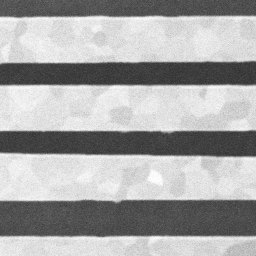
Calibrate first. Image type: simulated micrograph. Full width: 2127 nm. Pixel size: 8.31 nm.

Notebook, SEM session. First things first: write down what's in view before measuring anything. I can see lines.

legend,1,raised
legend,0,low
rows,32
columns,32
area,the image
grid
00000000000000000000000000000000
00000000000000000000000000000000
11111111111111111111111111111111
11111111111111111111111111111111
11111111111111111111111111111111
11111111111111111111111111111111
11111111111111111111111111111111
11111111111111111111111111111111
00000000000000000000000000000000
00000000000000000000000000000000
00000000000000000000000000000000
11111111111111111111111111111111
11111111111111111111111111111111
11111111111111111111111111111111
11111111111111111111111111111111
11111111111111111111111111111111
00000000000000000000000000000000
00000000000000000000000000000000
00000000000000000000000000000000
11111111111111111110000000000000
11111111111111111111111111111111
11111111111111111111111111111111
11111111111111111111111111111111
11111111111111111111111111111111
11111111111111111111111111111111
00000000000000000000000000000000
00000000000000000000000000000000
00000000000000000000000000000000
00000000000000000000000000000000
00000000000000000000000000000000
11111111111111111111111111111111
11111111111111111111111111111111